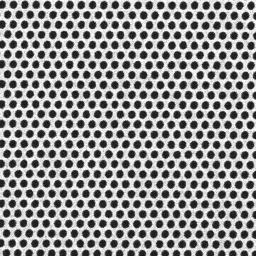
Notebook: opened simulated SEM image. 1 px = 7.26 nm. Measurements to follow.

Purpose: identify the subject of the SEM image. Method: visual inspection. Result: a regular array of holes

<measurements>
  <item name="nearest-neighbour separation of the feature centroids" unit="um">0.0796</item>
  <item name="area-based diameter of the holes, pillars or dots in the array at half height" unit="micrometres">0.0602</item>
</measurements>